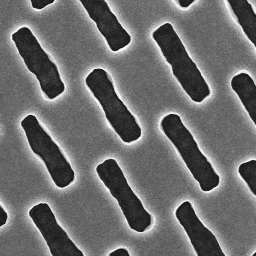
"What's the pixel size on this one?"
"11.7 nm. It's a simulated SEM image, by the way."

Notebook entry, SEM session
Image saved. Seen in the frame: holes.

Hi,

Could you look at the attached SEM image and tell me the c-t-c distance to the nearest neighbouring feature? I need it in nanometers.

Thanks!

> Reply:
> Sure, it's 936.